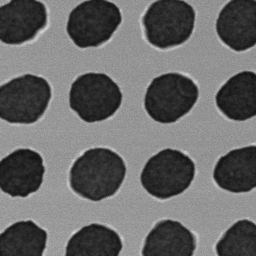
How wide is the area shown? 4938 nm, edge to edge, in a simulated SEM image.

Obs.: holes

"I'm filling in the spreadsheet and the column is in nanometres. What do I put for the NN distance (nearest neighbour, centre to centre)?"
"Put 1410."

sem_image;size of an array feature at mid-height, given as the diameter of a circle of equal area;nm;991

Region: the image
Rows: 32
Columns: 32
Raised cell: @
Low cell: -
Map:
@----@@@@@----@@@@@-----@@@@----
------@@@------@@@------@@@-----
------@@@------@@@------@@@-----
-----@@@-------@@@------@@@-----
----@@@@@-----@@@@------@@@-----
@-@@@@@@@----@@@@@@----@@@@@----
@@@@@@@@@@@@@@@@@@@@@@@@@@@@@@@@
@@@@@@@@@@@@@@@@@@@@@@@@@@@@@@@@
@@@@@@@@@@@@@@@@@@@@@@@@@@@@@@@@
@@---@@@@@---@@@@@@@---@@@@@@---
@-----@@@------@@@@-----@@@@----
------@@@------@@@-------@@-----
------@@@------@@@-------@@-----
------@@@------@@@------@@@-----
-----@@@@@----@@@@@----@@@@@----
@@@-@@@@@@@@@@@@@@@@@@@@@@@@@@@@
@@@@@@@@@@@@@@@@@@@@@@@@@@@@@@@@
@@@@@@@@@@@@@@@@@@@@@@@@@@@@@@@@
@@@@@@@@@@@@@@@@@@@@@@@@@@@@@@--
@----@@@@@-----@@@@----@@@@@----
-----@@@@-------@@------@@@-----
------@@@-------@@------@@@-----
-----@@@@------@@@------@@@-----
-----@@@@------@@@-----@@@@@----
@--@@@@@@@----@@@@@---@@@@@@@@@@
@@@@@@@@@@@@@@@@@@@@@@@@@@@@@@@@
@@@@@@@@@@@@@@@@@@@@@@@@@@@@@@@@
@@@@@@@@@@@@@@@@@@@@--@@@@@@@@-@
@----@@@@@----@@@@@----@@@@@@---
------@@@------@@@------@@@@----
------@@-------@@@-------@@-----
-----@@@-------@@@------@@@-----